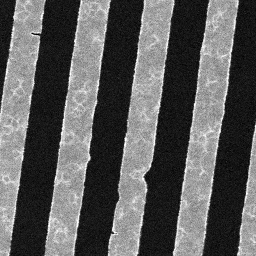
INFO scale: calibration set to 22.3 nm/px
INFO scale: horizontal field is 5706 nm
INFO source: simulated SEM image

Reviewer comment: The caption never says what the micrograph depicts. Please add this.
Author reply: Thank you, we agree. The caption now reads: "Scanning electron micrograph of one or a few lines or trenches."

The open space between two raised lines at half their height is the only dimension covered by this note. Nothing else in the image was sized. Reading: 778 nm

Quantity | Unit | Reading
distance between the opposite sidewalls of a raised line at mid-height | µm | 0.634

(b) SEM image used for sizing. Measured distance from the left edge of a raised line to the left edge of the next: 1.42 microns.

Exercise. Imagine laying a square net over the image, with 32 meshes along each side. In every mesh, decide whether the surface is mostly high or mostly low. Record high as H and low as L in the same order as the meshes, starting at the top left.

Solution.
LLHHHHLLLLHHHHLLLLHHHHLLLLHHHHLL
LLHHHLLLLLHHHLLLLLHHHHLLLLHHHHLL
LLHHHLLLLLHHHLLLLLHHHLLLLLHHHLLL
LLHHHLLLLLHHHLLLLLHHHLLLLLHHHLLL
LLHHHLLLLHHHHLLLLHHHHLLLLLHHHLLL
LHHHHLLLLHHHHLLLLHHHHLLLLHHHHLLL
LHHHHLLLLHHHHLLLLHHHHLLLLHHHHLLL
LHHHHLLLLHHHHLLLLHHHHLLLLHHHHLLL
LHHHLLLLLHHHHLLLLHHHHLLLLHHHHLLL
LHHHLLLLLHHHLLLLLHHHLLLLLHHHHLLL
LHHHLLLLLHHHLLLLLHHHLLLLLHHHHLLL
HHHHLLLLHHHHLLLLLHHHLLLLLHHHLLLL
HHHHLLLLHHHHLLLLHHHHLLLLHHHHLLLL
HHHHLLLLHHHHLLLLHHHHLLLLHHHHLLLL
HHHHLLLLHHHHLLLLHHHHLLLLHHHHLLLL
HHHLLLLLHHHHLLLLHHHHLLLLHHHHLLLL
HHHLLLLLHHHLLLLLHHHLLLLLHHHLLLLL
HHHLLLLLHHHLLLLLHHHLLLLLHHHLLLLL
HHHLLLLHHHHLLLLLHHHLLLLLHHHLLLLH
HHHLLLLHHHHLLLLHHHHLLLLHHHHLLLLH
HHHLLLLHHHHLLLLHHHHLLLLHHHHLLLLH
HHHLLLLHHHHLLLLHHHLLLLLHHHHLLLLH
HHLLLLLHHHHLLLLHHHLLLLLHHHHLLLLH
HHLLLLLHHHLLLLLHHHLLLLLHHHLLLLLH
HHLLLLLHHHLLLLLHHHLLLLLHHHLLLLLH
HHLLLLHHHHLLLLLHHHLLLLLHHHLLLLLH
HHLLLLHHHHLLLLHHHHLLLLHHHHLLLLHH
HHLLLLHHHHLLLLHHHHLLLLHHHHLLLLHH
HHLLLLHHHHLLLLHHHHLLLLHHHHLLLLHH
HLLLLLHHHHLLLLHHHLLLLLHHHHLLLLHH
HLLLLLHHHLLLLLHHHLLLLLHHHLLLLLHH
HLLLLLHHHLLLLLHHHLLLLLHHHLLLLLHH